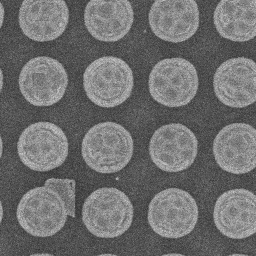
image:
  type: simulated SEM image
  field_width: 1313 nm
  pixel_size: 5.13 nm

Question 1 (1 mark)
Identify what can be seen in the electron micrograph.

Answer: a regular array of raised bodies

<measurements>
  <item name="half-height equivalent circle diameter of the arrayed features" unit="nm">237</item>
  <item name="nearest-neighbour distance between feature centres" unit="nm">334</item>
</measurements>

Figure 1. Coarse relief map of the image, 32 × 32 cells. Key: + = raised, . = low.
...+++++...+++++...+++++....++++
...+++++...+++++...++++++..+++++
...+++++...+++++...++++++..+++++
...+++++...+++++...+++++...+++++
....+++.....+++.....+++.....+++.
................................
................................
.....+.......++..............++.
...+++++...+++++....++++....++++
...+++++...+++++...+++++...+++++
...+++++...+++++...+++++...+++++
...+++++...+++++...+++++...+++++
....+++.....+++.....+++.....++++
................................
................................
................................
...++++....+++++....++++....++++
...+++++...+++++...+++++...+++++
...+++++...+++++...+++++...+++++
...+++++...+++++...+++++...+++++
...++++....++++.....+++.....++++
................................
................................
................................
...++++.....+++.....+++.....++++
...+++++...+++++...+++++...+++++
..++++++...+++++...+++++...+++++
...+++++...+++++...+++++...+++++
...++++....+++++...+++++....++++
.............................+..
................................
................................